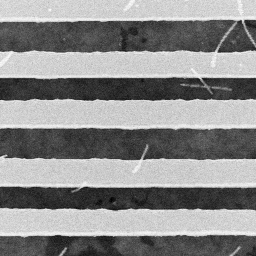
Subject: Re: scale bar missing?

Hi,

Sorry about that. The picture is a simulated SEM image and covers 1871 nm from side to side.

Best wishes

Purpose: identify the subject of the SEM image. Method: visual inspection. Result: lines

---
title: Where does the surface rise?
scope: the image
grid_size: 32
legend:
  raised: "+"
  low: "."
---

++++++++++++++++++++++++++++++++
++++++++++++++++++++++++++++++++
++++++++++++++++++++++++.+....+.
................................
................................
................................
....+.........+...+...++.......+
++++++++++++++++++++++++++++++++
++++++++++++++++++++++++++++++++
++++++++++++++++++++++++++++++++
................................
................................
....+.++++..+.........+.+.+.++++
++++++++++++++++++++++++++++++++
++++++++++++++++++++++++++++++++
++++++++++++++++++++++++++++++++
................................
................................
................................
................................
++++++++++++++++++++++++++++++++
++++++++++++++++++++++++++++++++
++++++++++++++++++++++++++++++++
................................
................................
................................
++++++++++++++++++++++++++++++++
++++++++++++++++++++++++++++++++
++++++++++++++++++++++++++++++++
................................
................................
................................